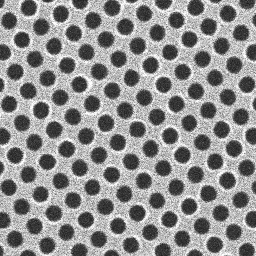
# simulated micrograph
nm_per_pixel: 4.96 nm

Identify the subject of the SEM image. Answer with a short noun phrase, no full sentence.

a regular array of holes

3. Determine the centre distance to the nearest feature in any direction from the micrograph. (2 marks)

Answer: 114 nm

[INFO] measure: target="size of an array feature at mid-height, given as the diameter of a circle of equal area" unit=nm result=77.3